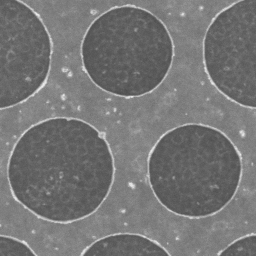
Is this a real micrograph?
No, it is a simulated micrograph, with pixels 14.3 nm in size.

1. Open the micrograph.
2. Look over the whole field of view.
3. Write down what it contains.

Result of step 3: holes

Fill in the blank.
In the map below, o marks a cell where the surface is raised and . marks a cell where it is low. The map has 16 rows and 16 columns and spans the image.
..ooooo.oooooo..
...ooo....ooo...
...oo......oo...
...oo......oo...
...oo.....ooo...
..oooo....oooo..
.oooooooooooooo.
ooo..ooooooooooo
o.....oooo....oo
o......ooo.....o
o......oo......o
o......oo......o
o.....oooo....oo
ooo..ooooooo.ooo
oooooooooooooooo
..oooo....oooo..